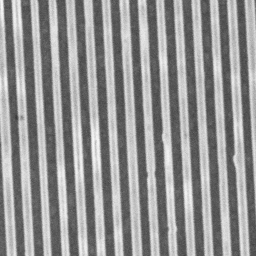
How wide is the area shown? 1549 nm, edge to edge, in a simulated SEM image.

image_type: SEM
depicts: parallel lines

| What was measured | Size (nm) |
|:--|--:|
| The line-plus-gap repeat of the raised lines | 108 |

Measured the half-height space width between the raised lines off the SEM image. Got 63.8 nm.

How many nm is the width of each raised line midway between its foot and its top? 46.1